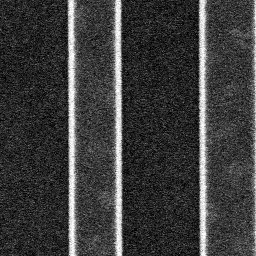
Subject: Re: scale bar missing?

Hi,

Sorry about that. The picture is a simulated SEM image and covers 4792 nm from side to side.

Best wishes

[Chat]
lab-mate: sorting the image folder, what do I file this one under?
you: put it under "one or a few lines or trenches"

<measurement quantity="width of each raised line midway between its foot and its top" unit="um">0.896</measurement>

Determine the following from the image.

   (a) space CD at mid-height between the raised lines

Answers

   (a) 1550 nm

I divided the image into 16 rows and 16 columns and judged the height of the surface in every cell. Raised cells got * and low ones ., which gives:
....***......***
....***......***
....***......***
....***......***
....***......***
....***......***
....***......***
....***......***
....***......***
....***......***
....***......***
....***......***
....***......***
....***......***
....***......***
....***......***